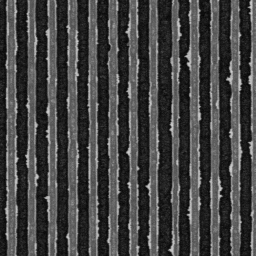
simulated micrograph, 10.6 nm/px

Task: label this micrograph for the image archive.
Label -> parallel lines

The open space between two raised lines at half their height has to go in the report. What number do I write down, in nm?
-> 120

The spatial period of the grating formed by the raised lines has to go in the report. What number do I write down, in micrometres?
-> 0.215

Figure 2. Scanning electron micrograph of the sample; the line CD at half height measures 90 nm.